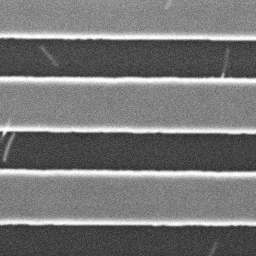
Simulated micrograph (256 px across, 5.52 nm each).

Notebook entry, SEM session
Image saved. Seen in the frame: lines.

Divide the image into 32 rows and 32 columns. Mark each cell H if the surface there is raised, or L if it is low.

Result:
HHHHHHHHHHHHHHHHHHHHHHHHHHHHHHHH
HHHHHHHHHHHHHHHHHHHHHHHHHHHHHHHH
HHHHHHHHHHHHHHHHHHHHHHHHHHHHHHHH
HHHHHHHHHHHHHHHHHHHHHHHHHHHHHHHH
HHHHHHHHHHHHHHHHHHHHHHHHHHHHHHHH
LLLLLLLLLLLLLLLLLLLLLLLLLLLLLLLL
LLLLLLLLLLLLLLLLLLLLLLLLLLLLLLLL
LLLLLLLLLLLLLLLLLLLLLLLLLLLLLLLL
LLLLLLLLLLLLLLLLLLLLLLLLLLLLLLLL
LLLLLLLLLLLLLLLLLLLLLLLLLLLLLLLL
HHHHHHHHHHHHHHHHHHHHHHHHHHHHHHHH
HHHHHHHHHHHHHHHHHHHHHHHHHHHHHHHH
HHHHHHHHHHHHHHHHHHHHHHHHHHHHHHHH
HHHHHHHHHHHHHHHHHHHHHHHHHHHHHHHH
HHHHHHHHHHHHHHHHHHHHHHHHHHHHHHHH
HHHHHHHHHHHHHHHHHHHHHHHHHHHHHHHH
LLLLLLLLLLLLLLLLLHLLHHHHHHHHHHHH
LLLLLLLLLLLLLLLLLLLLLLLLLLLLLLLL
LLLLLLLLLLLLLLLLLLLLLLLLLLLLLLLL
LLLLLLLLLLLLLLLLLLLLLLLLLLLLLLLL
LLLLLLLLLLLLLLLLLLLLLLLLLLLLLLLL
HHHHHHHHHHHHHHLLLLLLLLLLLLLLLLLL
HHHHHHHHHHHHHHHHHHHHHHHHHHHHHHHH
HHHHHHHHHHHHHHHHHHHHHHHHHHHHHHHH
HHHHHHHHHHHHHHHHHHHHHHHHHHHHHHHH
HHHHHHHHHHHHHHHHHHHHHHHHHHHHHHHH
HHHHHHHHHHHHHHHHHHHHHHHHHHHHHHHH
HHHHHHHHHHHHHHHHHHHHHHHHHHHHHHHH
LLLLLLLLLLLLLLLLLLLLLLLLLLLLLLLL
LLLLLLLLLLLLLLLLLLLLLLLLLLLLLLLL
LLLLLLLLLLLLLLLLLLLLLLLLLLLLLLLL
LLLLLLLLLLLLLLLLLLLLLLLLLLLLLLLL